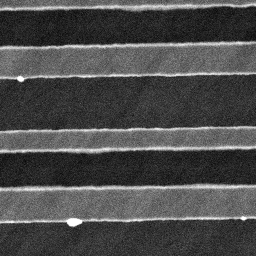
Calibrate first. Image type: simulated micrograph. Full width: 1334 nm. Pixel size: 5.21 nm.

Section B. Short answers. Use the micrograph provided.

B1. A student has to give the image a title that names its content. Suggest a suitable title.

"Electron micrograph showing lines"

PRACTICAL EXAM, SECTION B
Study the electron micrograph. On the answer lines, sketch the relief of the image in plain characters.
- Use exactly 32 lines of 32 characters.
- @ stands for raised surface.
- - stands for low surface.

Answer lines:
@@@@@@@@@@@@@@@@@@@@@@@@@@@@@@@@
--------------------------------
--------------------------------
--------------------------------
--------------------------------
-----------------------@-@-@@@@@
@@@@@@@@@@@@@@@@@@@@@@@@@@@@@@@@
@@@@@@@@@@@@@@@@@@@@@@@@@@@@@@@@
@@@@@@@@@@@@@@@@@@@@@@@@@@@@@@@@
@@@@@@@@@@@@@@@@-@---@----------
--------------------------------
--------------------------------
--------------------------------
--------------------------------
--------------------------------
--------------------------------
@@@@@@@@@@@@@@@@@@@@@@@@@@@@@@@@
@@@@@@@@@@@@@@@@@@@@@@@@@@@@@@@@
@@@@@@@@@@@@@@@@@@@@-@@---------
--------------------------------
--------------------------------
--------------------------------
--------------------------------
--------------@-@@@@@@@@@@@@@@@@
@@@@@@@@@@@@@@@@@@@@@@@@@@@@@@@@
@@@@@@@@@@@@@@@@@@@@@@@@@@@@@@@@
@@@@@@@@@@@@@@@@@@@@@@@@@@@@@@@@
@@@@@@@@@@@@@@@@@@--------------
--------------------------------
--------------------------------
--------------------------------
--------------------------------